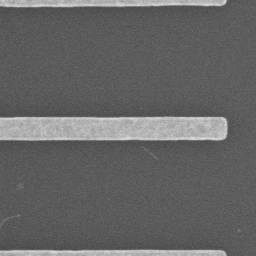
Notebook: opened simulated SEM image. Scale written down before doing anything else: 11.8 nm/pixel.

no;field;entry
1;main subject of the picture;wiring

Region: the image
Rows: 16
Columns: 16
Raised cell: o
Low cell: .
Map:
................
................
................
................
................
................
................
oooooooooooooo..
oooooooooooooo..
................
................
................
................
................
................
................